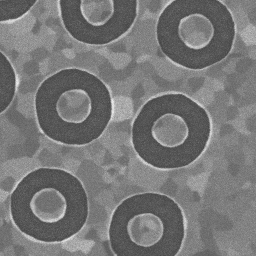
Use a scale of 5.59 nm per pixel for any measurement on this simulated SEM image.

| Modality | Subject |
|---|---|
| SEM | ring-shaped grooves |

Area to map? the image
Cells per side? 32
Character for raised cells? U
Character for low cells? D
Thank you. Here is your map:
DDDDUUUDDDUUUUDDDUUUUDDDDDDDUUUU
DDDUUUUUDDUUUUDDDUUUDDDDDDDDDUUU
DDUUUUUUDDDUUDDDDUUUDDDUUUDDDUUU
UUUUUUUUDDDDDDDDUUUUDDUUUUUDDUUU
UUUUUUUUUDDDDDDUUUUUDDDUUUUDDUUU
UUUUUUUUUUUDDUUUUUUUDDDUUUDDDUUU
UUUUUUUUUUUUUUUUUUUUDDDDDDDDDUUU
DUUUUUUUUUUUUUUUUUUUUDDDDDDDUUUU
DDUUUUUUUUUUUUUUUUUUUUUDDDUUUUUU
DDUUUUDDDDDDUUUUUUUUUUUUUUUUUUUU
DDUUUDDDDDDDDUUUUUUUUUUUUUUUUUUU
DDUUUDDDUUDDDDUUUUUUUUUUUUUUUUUU
DDUUDDDUUUUDDDUUUUUDDDDDUUUUUUUU
DUUUDDDUUUUDDDUUUUDDDDDDDUUUUUUU
UUUUUDDUUUUDDDUUUDDDUUDDDDUUUUUU
UUUUUDDDDDDDDUUUUDDUUUUDDDUUUUUU
UUUUUDDDDDDDDUUUUDDUUUUDDDUUUUUU
UUUUUUUDDDDDUUUUDDDDUUUDDDUUUUUU
UUUUUUUUUUUUUUUUUDDDDDDDDDUUUUUU
UUUUUUUUUUUUUUUUUDDDDDDDDUUUUUUU
UUUUUUUUUUUUUUUUUUUDDDDDUUUUUUUU
UUUUDDDDUUUUUUUUUUUUUUUUUUUUUUUU
UUUDDDDDDDUUUUUUUUUUUUUUUUUUUUUU
UUDDDDDDDDUUUUUUUUUUUUUUUUUUUUUU
UDDDUUUUDDDUUUUUUDDDDUUUUUUUUUUU
UDDDUUUUDDDUUUUDDDDDDDUUUUUUUUUU
UDDDUUUUDDDUUUDDDDDDDDDUUUUUUUUU
UUDDDUUDDDDUUUDDDUUUDDDUUUUUUUUU
UUDDDDDDDDUUUUDDUUUUDDDUUUUUUUUU
UUUDDDDDDUUUUUDDUUUUDDDUUUUUUUUU
UUUUUUUUUUUUUUDDDUUDDDDUUUUUUUUU
UUUUUUUUUUUUUUDDDDDDDDUUUUUUUUUU